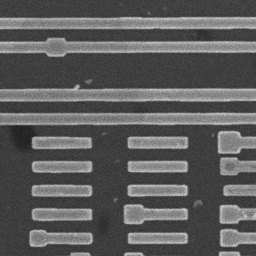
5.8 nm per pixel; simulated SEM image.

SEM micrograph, wiring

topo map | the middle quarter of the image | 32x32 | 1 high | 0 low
00000000000000000000000000000000
00000000000000000000000000000000
00000000000000000000000000000000
00000000000000000000000000000000
00000000000000000000000000000000
00000000000000000000000000000000
11100000011111111111111111111111
11111111111111111111111111111111
11111111111111111111111111111111
00000000000000000000000000000000
00000000000000000000000000000000
00000000000000000000000000000000
11111111111111111111111111111111
11111111111111111111111111111111
11111111111111111111111111111111
00000000000000000000000000000000
00000000000000000000000000000000
00000000000000000000000000000000
11000000000000001111111111111100
11111110000000001111111111111110
11111110000000001111111111111110
00000000000000000000000000000000
00000000000000000000000000000000
00000000000000000000000000000000
11111100000000001111111111111100
11111110000000001111111111111110
11111110000000001111111111111110
00000000000000000000000000000000
00000000000000000000000000000000
00000000000000000000000000000000
11000000000000001111111111110000
11111110000000001111111111111110